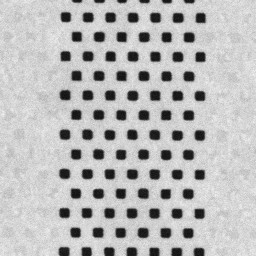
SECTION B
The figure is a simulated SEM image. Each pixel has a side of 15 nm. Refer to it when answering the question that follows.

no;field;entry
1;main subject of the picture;a regular array of holes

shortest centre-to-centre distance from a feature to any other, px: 22.2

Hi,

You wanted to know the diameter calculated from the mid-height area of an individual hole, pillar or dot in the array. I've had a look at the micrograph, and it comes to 0.172 micrometres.